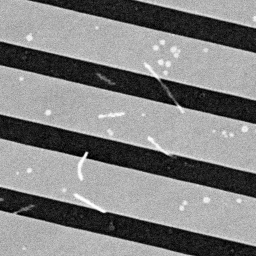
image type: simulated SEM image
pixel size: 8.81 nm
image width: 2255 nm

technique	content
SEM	lines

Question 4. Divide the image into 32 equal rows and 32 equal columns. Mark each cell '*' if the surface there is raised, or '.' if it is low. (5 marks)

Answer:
******.............*************
**********.............*********
**************.............*****
******************..............
***********************.........
.**************************.....
......*************************.
..........**********************
**............******************
******.............*************
**********.............*********
***************.............****
*******************.............
***********************.........
.**************************.....
......**************************
..........**********************
*.............******************
*****.............**************
**********.............*********
**************.............*****
******************.............*
**********************..........
.**************************.....
.....**************************.
.........***********************
*............*******************
*****.............**************
*********.............**********
*************.............******
******************............**
**********************..........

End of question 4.